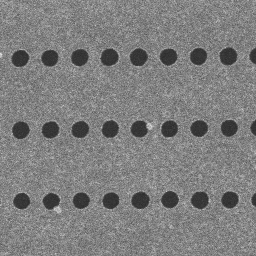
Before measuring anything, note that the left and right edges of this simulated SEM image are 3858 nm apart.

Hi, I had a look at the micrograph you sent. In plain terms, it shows a regular array of holes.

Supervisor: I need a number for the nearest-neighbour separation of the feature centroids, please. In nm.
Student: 447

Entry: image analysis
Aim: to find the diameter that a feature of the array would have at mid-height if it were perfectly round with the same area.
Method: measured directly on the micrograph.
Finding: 17.6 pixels